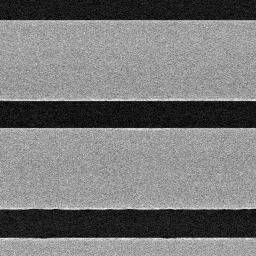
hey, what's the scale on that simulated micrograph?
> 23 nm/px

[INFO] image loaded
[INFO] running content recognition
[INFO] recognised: lines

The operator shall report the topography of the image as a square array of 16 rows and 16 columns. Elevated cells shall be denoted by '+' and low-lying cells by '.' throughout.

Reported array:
................
++++++++++++++++
++++++++++++++++
++++++++++++++++
++++++++++++++++
++++++++++++++++
................
................
++++++++++++++++
++++++++++++++++
++++++++++++++++
++++++++++++++++
++++++++++++++++
................
................
++++++++++++++++